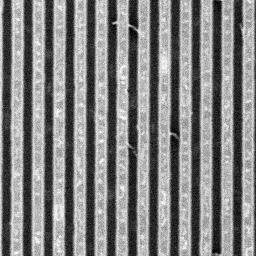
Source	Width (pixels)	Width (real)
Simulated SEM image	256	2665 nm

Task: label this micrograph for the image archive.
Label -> parallel lines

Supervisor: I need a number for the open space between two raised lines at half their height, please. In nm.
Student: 108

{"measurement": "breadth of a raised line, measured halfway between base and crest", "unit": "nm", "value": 108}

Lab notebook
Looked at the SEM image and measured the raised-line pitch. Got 219 nanometers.